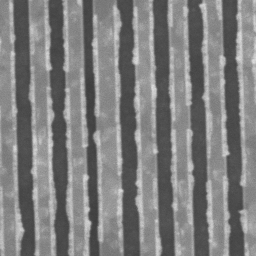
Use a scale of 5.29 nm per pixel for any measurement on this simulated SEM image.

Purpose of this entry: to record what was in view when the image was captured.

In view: parallel lines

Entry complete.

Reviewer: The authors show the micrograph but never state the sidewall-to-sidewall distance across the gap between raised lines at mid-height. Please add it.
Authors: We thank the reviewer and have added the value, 80 nm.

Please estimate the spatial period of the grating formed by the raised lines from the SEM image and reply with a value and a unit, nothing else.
184 nanometers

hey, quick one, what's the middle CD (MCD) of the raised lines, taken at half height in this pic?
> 105 nm